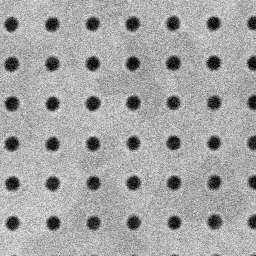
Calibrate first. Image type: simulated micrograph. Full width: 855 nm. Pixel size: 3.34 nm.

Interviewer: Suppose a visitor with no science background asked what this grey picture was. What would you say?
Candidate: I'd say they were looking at a regular array of holes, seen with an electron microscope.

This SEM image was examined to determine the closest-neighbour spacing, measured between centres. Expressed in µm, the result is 0.133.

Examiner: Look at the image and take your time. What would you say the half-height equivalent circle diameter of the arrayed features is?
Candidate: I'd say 0.0552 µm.